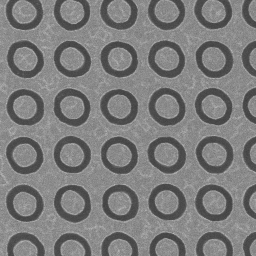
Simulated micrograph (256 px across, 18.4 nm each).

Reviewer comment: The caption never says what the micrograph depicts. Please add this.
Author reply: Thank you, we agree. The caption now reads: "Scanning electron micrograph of a regular array of ring-shaped grooves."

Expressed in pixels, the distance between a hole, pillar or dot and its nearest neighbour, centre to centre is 47.2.